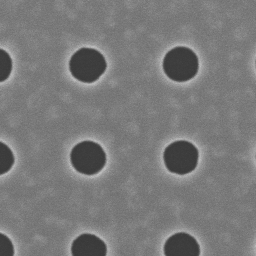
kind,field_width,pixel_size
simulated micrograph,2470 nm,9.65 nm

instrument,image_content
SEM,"holes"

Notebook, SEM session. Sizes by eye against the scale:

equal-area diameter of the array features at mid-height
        0.346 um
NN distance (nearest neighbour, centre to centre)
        0.897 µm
